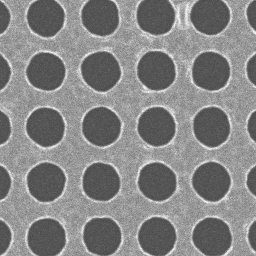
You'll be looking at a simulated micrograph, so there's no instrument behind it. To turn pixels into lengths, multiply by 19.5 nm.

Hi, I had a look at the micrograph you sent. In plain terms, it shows a regular array of holes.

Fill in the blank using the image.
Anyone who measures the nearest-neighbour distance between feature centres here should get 54.9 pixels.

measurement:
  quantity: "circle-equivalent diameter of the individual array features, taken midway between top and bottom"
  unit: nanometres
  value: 759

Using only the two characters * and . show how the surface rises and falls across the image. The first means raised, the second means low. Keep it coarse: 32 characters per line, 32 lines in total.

****...****...***....***....***.
.**.....**.....**.....**.....**.
.**.....**.....**.....**.....**.
.***....***....***...***....****
*****..*****.*******************
********************************
************.******.******.*****
.***....**.....**....***....***.
.**.....**.....**.....**.....**.
.**.....**.....**.....**.....**.
.***....***...****...***....****
********************************
********************************
*****.******.******.******.*****
.***....***....***...***....***.
.**.....**.....**.....**.....**.
.**.....**.....**.....**.....**.
.***....***....***...****...****
********************************
********************************
*****..*****.*****..*****..*****
.***....***....***....**....***.
.**.....**.....**.....**.....**.
.***....**.....**.....**.....**.
.***...****...****...****...****
********************************
********************************
*****..****...****...****...****
.***....***....***....**.....**.
.**.....**.....**.....**.....**.
.**.....***....**.....**.....**.
.***...****...****...****...****